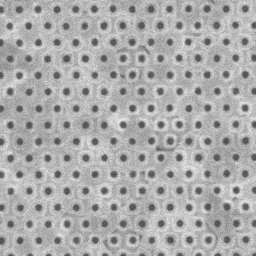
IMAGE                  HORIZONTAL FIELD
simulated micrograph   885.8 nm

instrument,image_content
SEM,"a regular array of holes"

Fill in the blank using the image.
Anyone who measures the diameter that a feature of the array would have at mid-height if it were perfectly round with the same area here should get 25.9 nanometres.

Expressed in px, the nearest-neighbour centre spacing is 18.5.